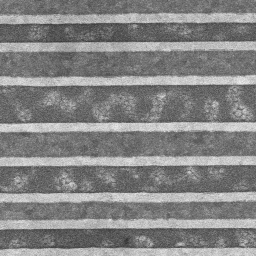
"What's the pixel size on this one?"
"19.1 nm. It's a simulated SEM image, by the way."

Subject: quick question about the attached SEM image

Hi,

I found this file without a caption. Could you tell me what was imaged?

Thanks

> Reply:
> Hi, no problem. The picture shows one or a few lines or trenches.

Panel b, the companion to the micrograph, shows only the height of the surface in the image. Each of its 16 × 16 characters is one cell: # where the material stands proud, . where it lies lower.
################
................
................
################
################
................
................
................
################
################
................
................
################
################
................
................